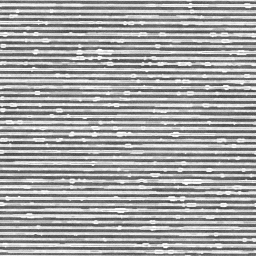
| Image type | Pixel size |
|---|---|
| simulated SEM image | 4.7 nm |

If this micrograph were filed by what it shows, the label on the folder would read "parallel lines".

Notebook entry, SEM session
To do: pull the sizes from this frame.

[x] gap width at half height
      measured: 17 nm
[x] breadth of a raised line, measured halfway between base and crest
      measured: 8.8 nanometres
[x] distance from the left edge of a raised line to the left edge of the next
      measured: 27.5 nm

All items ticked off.